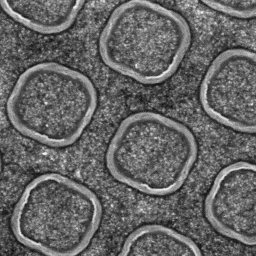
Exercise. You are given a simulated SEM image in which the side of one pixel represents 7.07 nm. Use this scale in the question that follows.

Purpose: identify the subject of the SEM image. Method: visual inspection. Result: raised bodies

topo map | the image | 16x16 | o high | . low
.oooo...oo....oo
..oo...oooo.....
.......ooooo....
.......oooo...oo
..oo....oo...ooo
.ooooo.......ooo
.ooooo.......ooo
.oooo...oo....oo
..ooo..ooooo....
.......ooooo....
.......ooooo...o
..oo....ooo...oo
.ooooo.......ooo
.ooooo.......ooo
.ooooo...oo...oo
...oo...oooo....